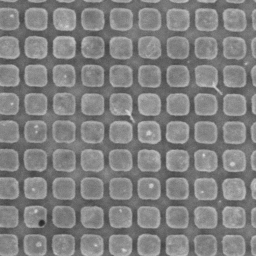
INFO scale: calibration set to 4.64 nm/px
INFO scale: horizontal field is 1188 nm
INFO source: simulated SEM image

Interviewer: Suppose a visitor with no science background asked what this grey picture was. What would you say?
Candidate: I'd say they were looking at a regular array of raised bodies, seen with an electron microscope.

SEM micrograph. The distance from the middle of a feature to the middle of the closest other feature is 130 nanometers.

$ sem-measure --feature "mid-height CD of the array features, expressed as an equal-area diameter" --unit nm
110